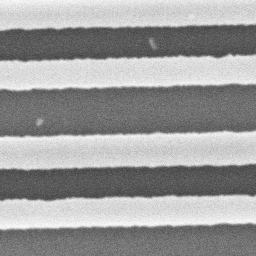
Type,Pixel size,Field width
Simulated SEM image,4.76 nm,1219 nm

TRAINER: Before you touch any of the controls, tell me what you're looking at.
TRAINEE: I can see lines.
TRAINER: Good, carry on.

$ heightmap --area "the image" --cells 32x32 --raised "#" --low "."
################################
################################
################################
##.#............................
................................
................................
................................
.........#######################
################################
################################
#######################.........
................................
................................
................................
................................
................................
................................
################################
################################
################################
###############################.
................................
................................
................................
...........................####.
################################
################################
################################
#...............................
................................
................................
................................